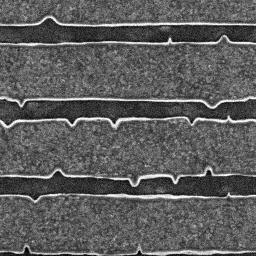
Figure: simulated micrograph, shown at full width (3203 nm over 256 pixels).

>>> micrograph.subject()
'one or a few lines or trenches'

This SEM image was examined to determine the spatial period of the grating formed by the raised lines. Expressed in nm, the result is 956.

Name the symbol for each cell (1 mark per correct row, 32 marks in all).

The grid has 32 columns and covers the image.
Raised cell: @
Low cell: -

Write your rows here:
@@@@@@@@@@@@@@@@@@@@@@@@@@@@@@@@
@@@@@@@@@@@@@@@@@@@@@@@@@@@@@@@@
@@@@@--@@@@@@@@@@@@@@@@@@@@@@@@@
--------------------------------
--------------------------------
----------@@@@@@@@---@@@@@@@@@@@
@@@@@@@@@@@@@@@@@@@@@@@@@@@@@@@@
@@@@@@@@@@@@@@@@@@@@@@@@@@@@@@@@
@@@@@@@@@@@@@@@@@@@@@@@@@@@@@@@@
@@@@@@@@@@@@@@@@@@@@@@@@@@@@@@@@
@@@@@@@@@@@@@@@@@@@@@@@@@@@@@@@@
@@@@@@@@@@@@@@@@@@@@@@@@@@@@@@@@
-@@@--------------@@@@@@@@@@@@--
--------------------------------
--------------------------------
--@@@@@@@@@@@@@@@@@@@@@@@@@@@@@@
@@@@@@@@@@@@@@@@@@@@@@@@@@@@@@@@
@@@@@@@@@@@@@@@@@@@@@@@@@@@@@@@@
@@@@@@@@@@@@@@@@@@@@@@@@@@@@@@@@
@@@@@@@@@@@@@@@@@@@@@@@@@@@@@@@@
@@@@@@@@@@@@@@@@@@@@@@@@@@@@@@@@
@@@@@@@-@@@@@@@@@@@@@@@@@@@@@@@@
----------------@---------------
--------------------------------
@@@--@@@@@@@@@--------------@---
@@@@@@@@@@@@@@@@@@@@@@@@@@@@@@@@
@@@@@@@@@@@@@@@@@@@@@@@@@@@@@@@@
@@@@@@@@@@@@@@@@@@@@@@@@@@@@@@@@
@@@@@@@@@@@@@@@@@@@@@@@@@@@@@@@@
@@@@@@@@@@@@@@@@@@@@@@@@@@@@@@@@
@@@@@@@@@@@@@@@@@@@@@@@@@@@@@@@@
-@@-@@@@@@@@@@@@@@@@@@@-@@---@--